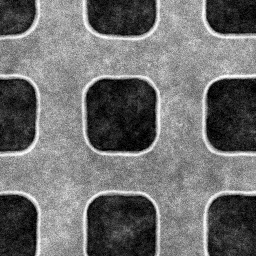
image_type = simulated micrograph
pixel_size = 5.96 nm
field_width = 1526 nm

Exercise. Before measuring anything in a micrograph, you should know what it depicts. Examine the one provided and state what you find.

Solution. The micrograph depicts holes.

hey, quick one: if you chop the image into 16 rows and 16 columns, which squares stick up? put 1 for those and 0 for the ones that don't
0011100000111000
0011110000111000
1111111111111111
1111111111111111
1111111111111111
0011110000111000
0011100000111000
0011100000111000
0011100000111000
0111111001111100
1111111111111111
1111111111111111
0011110001111000
0011100000111000
0011100000111000
0011100000111000